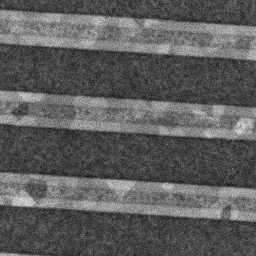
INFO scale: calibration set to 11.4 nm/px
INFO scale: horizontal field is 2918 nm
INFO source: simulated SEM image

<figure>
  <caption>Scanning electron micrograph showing one or a few lines or trenches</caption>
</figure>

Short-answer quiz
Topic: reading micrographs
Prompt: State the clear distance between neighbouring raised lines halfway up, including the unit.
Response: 641 nanometres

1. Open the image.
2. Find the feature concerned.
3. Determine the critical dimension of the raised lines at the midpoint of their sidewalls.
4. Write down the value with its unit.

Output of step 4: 277 nm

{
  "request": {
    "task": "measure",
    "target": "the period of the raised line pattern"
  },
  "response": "921 nm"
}